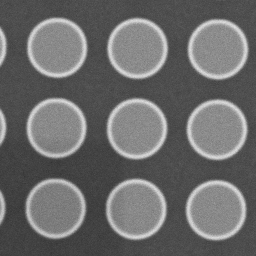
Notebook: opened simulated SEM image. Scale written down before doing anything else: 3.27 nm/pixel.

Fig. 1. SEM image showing an array of small figures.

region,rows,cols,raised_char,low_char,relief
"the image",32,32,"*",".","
................................
................................
......***.......**..............
....******....******.....*****..
*...*******...*******...*******.
*...*******..********...*******.
*...*******..********..********.
....******....*******...*******.
....******....******....******..
......**........***.......***...
................................
................................
......**........**.........*....
....******....******.....*****..
....******....******....*******.
*..********..********..********.
*..********..********..********.
....******....*******...*******.
....******....******....******..
......**........***......****...
................................
................................
......**........**..............
....******....******.....****...
....******....******....******..
*..********..********..********.
*..********..********..********.
....******...*******....*******.
....******....******....******..
.....***.......****......****...
................................
................................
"